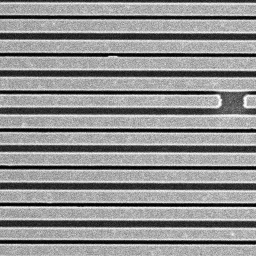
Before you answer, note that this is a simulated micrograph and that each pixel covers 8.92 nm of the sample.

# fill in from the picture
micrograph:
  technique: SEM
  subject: parallel lines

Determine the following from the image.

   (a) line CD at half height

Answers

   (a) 119 nanometers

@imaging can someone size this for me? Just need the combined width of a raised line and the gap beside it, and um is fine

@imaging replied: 0.167